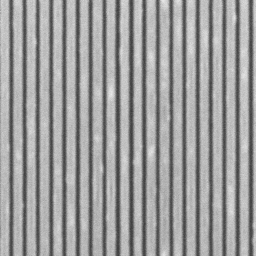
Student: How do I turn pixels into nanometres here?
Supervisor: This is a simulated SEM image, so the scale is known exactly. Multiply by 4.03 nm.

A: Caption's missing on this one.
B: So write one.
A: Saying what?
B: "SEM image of parallel lines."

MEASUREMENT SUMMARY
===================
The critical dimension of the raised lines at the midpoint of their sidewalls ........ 37.3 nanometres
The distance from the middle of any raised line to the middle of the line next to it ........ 53.5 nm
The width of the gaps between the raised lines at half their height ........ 17.1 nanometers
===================